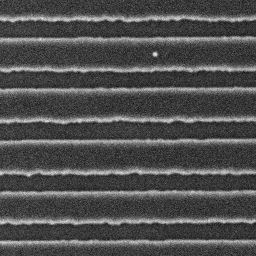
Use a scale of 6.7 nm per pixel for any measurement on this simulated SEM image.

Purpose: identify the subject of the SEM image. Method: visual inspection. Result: lines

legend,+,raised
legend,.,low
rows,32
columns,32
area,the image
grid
++++++++++++++++++++++++++++++++
++++++++++++++++++++++++++++++++
+++++++++++++++++++++....+++++++
................................
................................
++++++++++++++++++++++++++++++++
++++++++++++++++++++++++++++++++
++++++++++++++++++++++++++++++++
++++++++++++++++++++++++++++++++
................................
................................
++++++++++++++++++++++++++++++++
++++++++++++++++++++++++++++++++
++++++++++++++++++++++++++++++++
++++++++++++++++++++++++++++++++
................................
................................
..................+...++++++++++
++++++++++++++++++++++++++++++++
++++++++++++++++++++++++++++++++
++++++++++++++++++++++++++++++++
++++++++++++++++++++++++++++++++
................................
................................
++++++++++++++++++++++++++++++++
++++++++++++++++++++++++++++++++
++++++++++++++++++++++++++++++++
++++++++++++++++++++++++++++++++
................................
................................
++++++++++++++++++++++++++++++++
++++++++++++++++++++++++++++++++